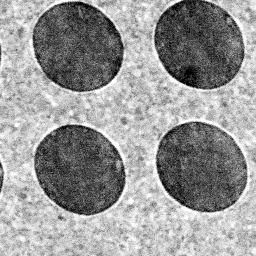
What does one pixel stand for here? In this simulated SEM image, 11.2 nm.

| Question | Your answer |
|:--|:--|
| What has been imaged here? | holes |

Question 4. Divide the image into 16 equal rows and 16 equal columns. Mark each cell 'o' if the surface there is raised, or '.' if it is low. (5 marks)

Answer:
ooo...oooo....oo
oo.....ooo.....o
oo......oo.....o
oo......oo.....o
ooo....ooo.....o
oooo..oooooo..oo
oooooooooooooooo
oooooooooooooooo
ooo....ooo....oo
oo.....ooo.....o
oo......oo.....o
oo......oo.....o
ooo....oooo....o
oooooooooooooooo
oooooooooooooooo
oooooooooooooooo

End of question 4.